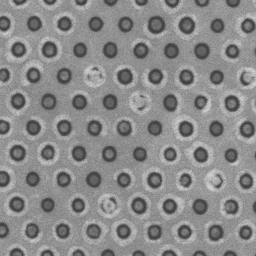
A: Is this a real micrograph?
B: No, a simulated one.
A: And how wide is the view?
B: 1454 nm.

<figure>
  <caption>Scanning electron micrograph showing a regular array of ring-shaped grooves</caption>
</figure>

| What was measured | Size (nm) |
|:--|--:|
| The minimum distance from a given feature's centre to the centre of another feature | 168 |